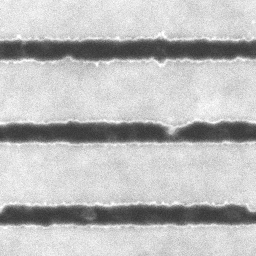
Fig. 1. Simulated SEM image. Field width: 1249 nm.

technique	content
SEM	one or a few lines or trenches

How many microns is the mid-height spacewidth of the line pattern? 0.288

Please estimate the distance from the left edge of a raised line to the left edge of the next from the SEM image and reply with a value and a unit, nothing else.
0.403 µm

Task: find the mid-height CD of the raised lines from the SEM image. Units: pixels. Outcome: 23.1